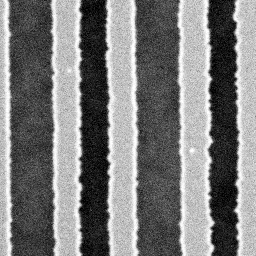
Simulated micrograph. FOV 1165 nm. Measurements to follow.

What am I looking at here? lines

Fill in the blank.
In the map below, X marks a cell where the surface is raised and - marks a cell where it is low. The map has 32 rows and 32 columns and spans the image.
X-----XXXX---XXXX------XXX---XXX
X------XXX----XXX-----XXXX---XXX
X------XXX---XXXX-----XXXX---XXX
X------XXX---XXXX-----XXXX----XX
X------XXX---XXXX------XXX----XX
X------XXX---XXXX------XXX----XX
X------XXX---XXXX------XXX----XX
X------XXX---XXXX-----XXXX----XX
X------XXX---XXXX-----XXXX----XX
X------XXX----XXX-----XXXX----XX
X------XXX----XXX-----XXXX----XX
X------XXX----XXX------XXX----XX
X------XXX----XXX------XXX----XX
X------XXX----XXX------XXX----XX
X------XXX----XXX------XXX----XX
X------XXX----XXX------XXX----XX
X------XXX----XXX------XXX----XX
X------XXX----XXX------XXX----XX
X------XXX----XXX------XXX----XX
X------XXX----XXX------XXX----XX
X------XXX----XXX------XXX----XX
X------XXX----XXX------XXX----XX
X------XXX----XXX------XXX----XX
X------XXX----XXX------XXX----XX
X------XXX----XXX------XXX----XX
X------XXX----XXX------XXX----XX
X------XXX----XXX------XXX----XX
X------XXX----XXX------XXXX---XX
X------XXX----XXX------XXX----XX
X------XXX----XXX------XXX----XX
X------XXX----XXX------XXX----XX
X------XXX----XXX------XXX----XX